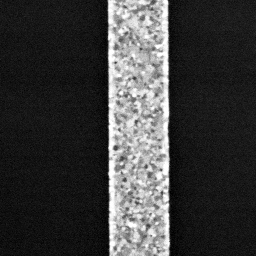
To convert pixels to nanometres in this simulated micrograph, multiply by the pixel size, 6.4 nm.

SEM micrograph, one or a few lines or trenches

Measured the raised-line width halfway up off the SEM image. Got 0.35 microns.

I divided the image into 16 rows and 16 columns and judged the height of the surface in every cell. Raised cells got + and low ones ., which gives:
.......+++......
.......+++......
.......+++......
.......+++......
.......+++......
.......+++......
.......+++......
.......+++......
.......+++......
.......+++......
.......+++......
.......+++......
.......+++......
.......+++......
.......+++......
.......+++......